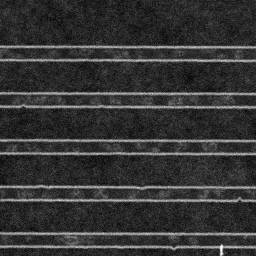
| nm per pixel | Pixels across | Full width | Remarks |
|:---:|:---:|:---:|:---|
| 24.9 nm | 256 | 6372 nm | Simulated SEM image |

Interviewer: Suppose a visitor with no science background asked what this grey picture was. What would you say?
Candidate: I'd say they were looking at parallel lines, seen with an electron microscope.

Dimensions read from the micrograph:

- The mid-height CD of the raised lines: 333 nanometers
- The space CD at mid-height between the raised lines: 0.823 microns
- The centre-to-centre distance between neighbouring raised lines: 1160 nanometers